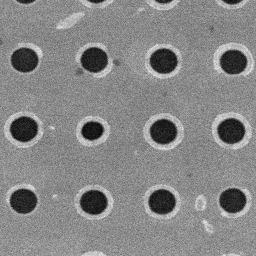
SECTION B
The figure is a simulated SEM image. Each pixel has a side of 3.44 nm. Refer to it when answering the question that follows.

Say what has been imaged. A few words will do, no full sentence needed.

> a regular array of holes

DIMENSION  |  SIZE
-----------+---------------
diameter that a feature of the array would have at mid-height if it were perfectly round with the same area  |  96.1 nm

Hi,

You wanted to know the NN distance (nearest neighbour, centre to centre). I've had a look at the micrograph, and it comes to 237 nm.